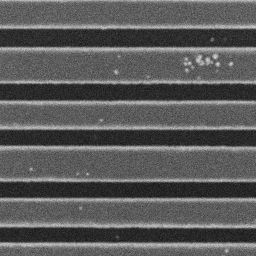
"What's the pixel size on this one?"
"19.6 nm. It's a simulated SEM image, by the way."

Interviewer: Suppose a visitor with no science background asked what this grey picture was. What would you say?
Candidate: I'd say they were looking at lines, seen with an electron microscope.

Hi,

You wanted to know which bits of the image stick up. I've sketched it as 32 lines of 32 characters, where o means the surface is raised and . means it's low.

oooooooooooooooooooooooooooooooo
oooooooooooooooooooooooooooooooo
oooooooooooooooooooooooooooooooo
oooooooooooooooooooooooooooooooo
................................
................................
oooooooooooooooooooooooooooooooo
oooooooooooooooooooooooooooooooo
oooooooooooooooooooooooooooooooo
oooooooooooooooooooooooooooooooo
................................
................................
................................
oooooooooooooooooooooooooooooooo
oooooooooooooooooooooooooooooooo
oooooooooooooooooooooooooooooooo
................................
................................
oooooooooooooooooooooooooooooooo
oooooooooooooooooooooooooooooooo
oooooooooooooooooooooooooooooooo
oooooooooooooooooooooooooooooooo
oooooooooooooooooooooooooooooooo
................................
................................
oooooooooooooooooooooooooooooooo
oooooooooooooooooooooooooooooooo
oooooooooooooooooooooooooooooooo
................................
................................
oooooooooooooooooooooooooooooooo
oooooooooooooooooooooooooooooooo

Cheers